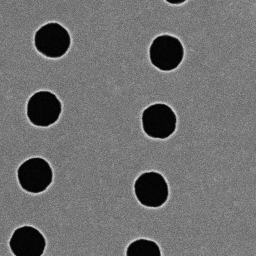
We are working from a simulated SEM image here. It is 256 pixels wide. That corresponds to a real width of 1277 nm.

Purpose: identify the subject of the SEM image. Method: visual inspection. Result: holes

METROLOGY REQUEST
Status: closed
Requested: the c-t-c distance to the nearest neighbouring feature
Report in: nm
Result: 343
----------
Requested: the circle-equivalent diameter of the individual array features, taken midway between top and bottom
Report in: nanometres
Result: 173